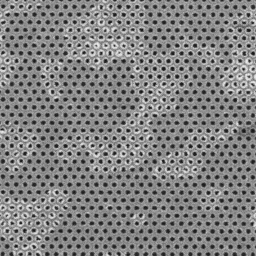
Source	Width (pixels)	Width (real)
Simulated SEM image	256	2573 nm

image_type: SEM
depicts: a regular array of holes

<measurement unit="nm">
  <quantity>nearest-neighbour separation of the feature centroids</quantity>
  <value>85.4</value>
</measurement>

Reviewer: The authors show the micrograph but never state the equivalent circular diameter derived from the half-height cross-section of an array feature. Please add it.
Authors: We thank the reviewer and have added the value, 48.1 nanometres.